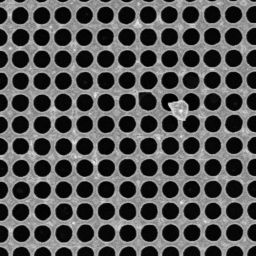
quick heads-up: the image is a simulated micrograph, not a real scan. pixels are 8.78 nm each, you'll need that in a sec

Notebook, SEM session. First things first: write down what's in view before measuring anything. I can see a regular array of holes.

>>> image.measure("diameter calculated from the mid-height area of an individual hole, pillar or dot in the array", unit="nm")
150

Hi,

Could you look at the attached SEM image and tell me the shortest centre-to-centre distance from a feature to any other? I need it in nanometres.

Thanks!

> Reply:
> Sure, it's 186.